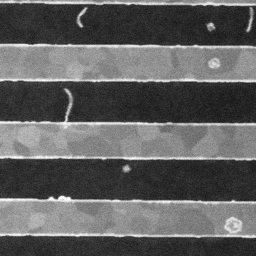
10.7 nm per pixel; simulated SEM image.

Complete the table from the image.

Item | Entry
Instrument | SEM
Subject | lines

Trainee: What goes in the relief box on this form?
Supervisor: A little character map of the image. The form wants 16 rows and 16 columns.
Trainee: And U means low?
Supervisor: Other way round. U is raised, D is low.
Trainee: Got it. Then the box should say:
DDDDDDDDDDDDDDDD
DDDDDDDDDDDDDDDD
DDDDDDDDDDDDDDDD
UUUUUUUUUUUUUUUU
UUUUUUUUUUUUUUUU
DDDDDDDDDDDDDDDD
DDDDDDDDDDDDDDDD
DDDDDDDDDDDDDDDD
UUUUUUUUUUUUUUUU
UUUUUUUUUUUUUUUU
DDDDDDDDDDDDDDDD
DDDDDDDDDDDDDDDD
UUUUUDDDDDDDDDDD
UUUUUUUUUUUUUUUU
UUUUUUUUUUUUUUUU
DDDDDDDDDDDDDDDD